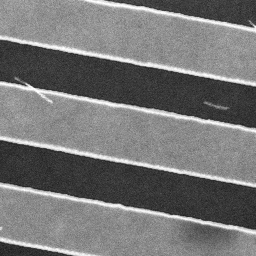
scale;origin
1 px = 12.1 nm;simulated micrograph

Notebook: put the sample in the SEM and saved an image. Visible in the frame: lines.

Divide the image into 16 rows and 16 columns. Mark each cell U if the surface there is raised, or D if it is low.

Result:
UUUUUUUUUDDDDDDD
UUUUUUUUUUUUUUDD
UUUUUUUUUUUUUUUU
DDDDDDUUUUUUUUUU
DDDDDDDDDDDUUUUU
UUDDDDDDDDDDDDDD
UUUUUUUDDDDDDDDD
UUUUUUUUUUUUUDDD
UUUUUUUUUUUUUUUU
DDDDUUUUUUUUUUUU
DDDDDDDDDDUUUUUU
DDDDDDDDDDDDDDDU
UUUUUUDDDDDDDDDD
UUUUUUUUUUUDDDDD
UUUUUUUUUUUUUUUU
DDUUUUUUUUUUUUUU